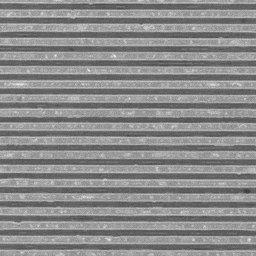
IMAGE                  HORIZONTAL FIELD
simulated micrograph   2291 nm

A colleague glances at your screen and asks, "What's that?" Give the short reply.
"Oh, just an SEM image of parallel lines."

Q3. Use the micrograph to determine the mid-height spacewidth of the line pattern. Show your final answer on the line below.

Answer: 60.4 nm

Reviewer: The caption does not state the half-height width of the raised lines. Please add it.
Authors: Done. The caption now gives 68.3 nm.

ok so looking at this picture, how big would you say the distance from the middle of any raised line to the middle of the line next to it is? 127 nanometres